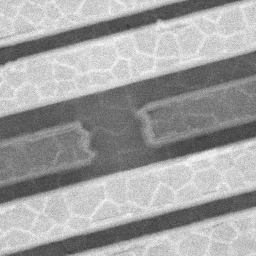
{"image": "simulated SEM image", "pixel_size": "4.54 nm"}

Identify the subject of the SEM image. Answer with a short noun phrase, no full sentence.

one or a few lines or trenches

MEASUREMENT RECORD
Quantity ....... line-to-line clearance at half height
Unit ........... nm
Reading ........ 95.6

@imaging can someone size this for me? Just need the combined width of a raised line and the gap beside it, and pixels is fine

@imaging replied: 67.4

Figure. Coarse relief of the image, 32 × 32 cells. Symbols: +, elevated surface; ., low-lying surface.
++++++++++++++++++++..........++
++++++++++++++++..........++++++
++++++++++++..........++++++++++
+++++++++.........++++++++++++++
+++++.........++++++++++++++++++
+..........+++++++++++++++++++++
.......+++++++++++++++++++++++..
...+++++++++++++++++++++++......
++++++++++++++++++++++..........
+++++++++++++++++++.............
+++++++++++++++..............+++
+++++++++++..............+++++++
+++++++..............+++++++++++
+++...............++++++++++++++
..................++++++++++++++
..................+++++++++++...
......+++++.......++++++++......
..+++++++++........+++..........
+++++++++++.................++++
++++++++++++............++++++++
++++++++++..........++++++++++++
++++++..........++++++++++++++++
++...........+++++++++++++++++++
.........+++++++++++++++++++++++
.....+++++++++++++++++++++++....
.+++++++++++++++++++++++........
++++++++++++++++++++...........+
++++++++++++++++...........+++++
++++++++++++...........+++++++++
++++++++...........+++++++++++++
+++++..........+++++++++++++++++
+..........+++++++++++++++++++++